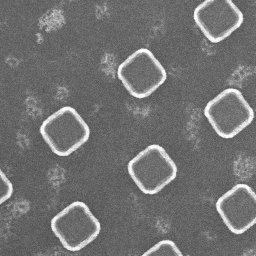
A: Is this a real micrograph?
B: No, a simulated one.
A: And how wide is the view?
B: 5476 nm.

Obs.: raised bodies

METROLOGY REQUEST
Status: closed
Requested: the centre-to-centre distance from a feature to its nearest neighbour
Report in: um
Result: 2.04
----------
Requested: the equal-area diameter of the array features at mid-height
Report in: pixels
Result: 42.2